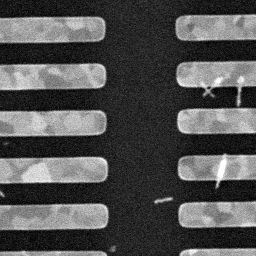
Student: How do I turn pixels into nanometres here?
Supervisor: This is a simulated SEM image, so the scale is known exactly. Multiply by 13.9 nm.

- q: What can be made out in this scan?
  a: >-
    groups of lines, slits or small figures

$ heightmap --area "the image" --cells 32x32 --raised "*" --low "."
................................
................................
*************.........**********
*************.........**********
*************.........**********
................................
................................
................................
*************.........**********
*************.........**********
*************.........**********
................................
................................
................................
*************.........**********
*************.........**********
*************..........*********
................................
................................
.........................*******
*************.........**********
*************.........**********
*************..............*....
................................
................................
.......................*********
*************.........**********
*************.........**********
********........................
................................
................................
..........**...........*********